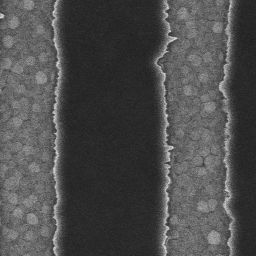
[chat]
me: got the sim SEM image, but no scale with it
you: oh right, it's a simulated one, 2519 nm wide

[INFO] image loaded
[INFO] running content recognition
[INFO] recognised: one or a few lines or trenches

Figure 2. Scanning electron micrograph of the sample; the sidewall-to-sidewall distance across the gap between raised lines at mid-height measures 586 nm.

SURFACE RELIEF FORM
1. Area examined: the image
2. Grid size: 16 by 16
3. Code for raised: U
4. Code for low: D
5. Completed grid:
DDDUUUUUUUDDDDUU
DDDUUUUUUUUDDDUU
DDDUUUUUUUUDDDUU
DDDDUUUUUUDDDDUU
DDDDUUUUUUDDDDUU
DDDDUUUUUUDDDDUU
DDDUUUUUUUDDDDUU
DDDUUUUUUUDDDDUU
DDDUUUUUUUDDDDUU
DDDUUUUUUUUDDDUU
DDDUUUUUUUUDDDUU
DDDUUUUUUUUDDDUU
DDDDUUUUUUDDDDUU
DDDUUUUUUUDDDDUU
DDDUUUUUUUDDDDUU
DDDUUUUUUUDDDDUU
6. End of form